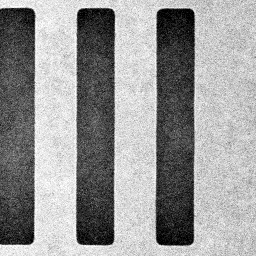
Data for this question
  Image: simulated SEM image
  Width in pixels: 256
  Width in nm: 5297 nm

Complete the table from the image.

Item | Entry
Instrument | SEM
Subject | groups of lines, slits or small figures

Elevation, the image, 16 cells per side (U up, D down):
DDUUUDDUUUDUUUUU
DDUUUDDUUUDDUUUU
DDUUUDDUUUDDUUUU
DDUUUDDUUUDDUUUU
DDUUUDDUUUDDUUUU
DDUUUDDUUUDDUUUU
DDUUUDDUUUDDUUUU
DDUUUDDUUUDDUUUU
DDUUUDDUUUDDUUUU
DDUUUDDUUUDDUUUU
DDUUUDDUUUDDUUUU
DDUUUDDUUUDDUUUU
DDUUUDDUUUDDUUUU
DDUUUDDUUUDDUUUU
DDUUUDDUUUDDUUUU
UUUUUUUUUUUUUUUU